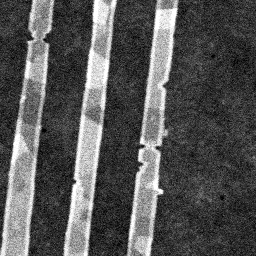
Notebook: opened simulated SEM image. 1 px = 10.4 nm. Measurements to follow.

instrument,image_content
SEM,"one or a few lines or trenches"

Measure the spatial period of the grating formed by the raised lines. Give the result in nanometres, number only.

643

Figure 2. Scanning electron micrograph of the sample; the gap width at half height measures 454 nanometers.